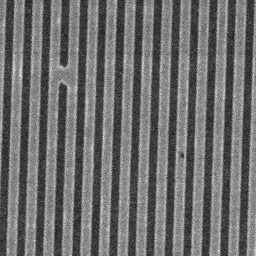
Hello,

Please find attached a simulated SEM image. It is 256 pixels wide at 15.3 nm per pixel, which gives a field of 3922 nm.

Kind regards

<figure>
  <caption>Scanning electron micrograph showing parallel lines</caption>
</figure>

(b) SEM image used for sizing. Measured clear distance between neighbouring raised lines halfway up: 132 nanometres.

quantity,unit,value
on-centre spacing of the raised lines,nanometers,283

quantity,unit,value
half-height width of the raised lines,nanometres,153